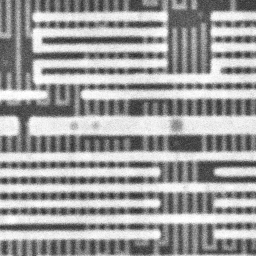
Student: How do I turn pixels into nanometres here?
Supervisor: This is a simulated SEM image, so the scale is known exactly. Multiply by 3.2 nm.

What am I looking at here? wiring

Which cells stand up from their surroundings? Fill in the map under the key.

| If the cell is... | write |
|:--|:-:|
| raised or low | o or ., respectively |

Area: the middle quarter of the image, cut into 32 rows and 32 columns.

oooooooooooooooooooooooooo......
................................
................................
oooooooooooooooooooooooooooooooo
oooooooooooooooooooooooooooooooo
................................
................................
....oooooooooooooooooooooooooooo
.....ooooooooooooooooooooooooooo
................................
................................
................................
................................
....oooooooooooooooooooooooooooo
oooooooooooooooooooooooooooooooo
oooooooooooooooooooooooooooooooo
oooooooooooooooooooooooooooooooo
oooooooooooooooooooooooooooooooo
................................
................................
................................
................................
oooooooooooooooooooooooooooooooo
oooooooooooooooooooooooooooooooo
................................
................................
oooooooooooooooooooooooo........
oooooooooooooooooooooooo........
................................
................................
oooooooooooooooooooooooooooooooo
oooooooooooooooooooooooooooooooo